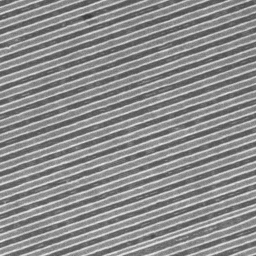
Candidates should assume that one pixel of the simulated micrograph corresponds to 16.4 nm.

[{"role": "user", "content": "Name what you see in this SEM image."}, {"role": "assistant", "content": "parallel lines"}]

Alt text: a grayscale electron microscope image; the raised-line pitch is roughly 0.221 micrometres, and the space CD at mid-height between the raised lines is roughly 105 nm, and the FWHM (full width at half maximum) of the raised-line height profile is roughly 120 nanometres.